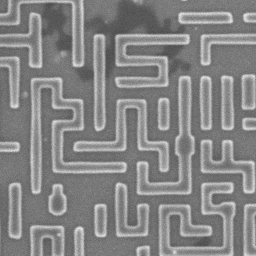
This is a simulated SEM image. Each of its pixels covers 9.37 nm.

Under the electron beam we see wiring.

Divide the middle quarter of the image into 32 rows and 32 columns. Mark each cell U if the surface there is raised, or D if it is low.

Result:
DDDUUDDDUUDDDDDDDDDDDDDUUUDDDDDD
DDDDDDDDUUDDDDDDDDDDDDDDUUDDDDDD
DDDDDDDDUUDDDDDDDDDDDDDDUUDDDDDD
DDDDDDDDUUDDDDDUDDDDDDDUUUDDDUUD
DDDDDDDDUUDDDUUUUUUUUUUUUUDDDUUU
DDDDDDDDUUDDDDUUUUUUUUUUUUDDDUUU
DDDDDDDDUUDDDDDDDDDDDDDDDDDDDUUU
DDDDDDDDUUDDDDDDDDDDDDDDDDDDDUUU
DDDDDDDDUUDDDDDDDDDDDDDDDDDDDUUU
UUUUUDDDUUDDDUUUUUUUDDDDUUDDDUUU
UUUUUDDDUUDDDUUUUUUUDDDDUUDDDUUU
DDUUUDDDUUDDDUUDDDUUDDDDUUDDDUUD
DDDUUDDDUUDDDUUDDDDUDDDDUUDDDUUD
DDUUUDDDUUDDDUUDDDDUDDDDUUDDDUUD
UUUUUDDDUUDDDUUDDDDUDDDDUUDDDUUD
UUUUUDDDUUDDDUUDDDUUDDDDUUDDDUUD
DDDDDDDDUDDDDUUDDDUUDDDDDDDDDUUD
DDDDDDDDDDDDDUUDDDUUDDDDDDDDDUUU
DDDDDDDDDDDDDUUDDDUUUDDDDDDDUUUU
DDDUUUDDDDDDUUUDDDUUUUDDUDDDUUUU
DDDUUUUUUUUUUUUDDDDUUUUUUUDDUUUU
DDDUUUUUUUUUUUUDDDDDDDDUUUDDUUUU
DDDDDDDDDDDDDDDDDDDDDDDDUUDDUUUU
DDDDDDDDDDDDDDDDDDDDDDDDUUDDDUUU
DDDDDDDDDDDDDDDDDDDDDDDDUUDDDUUU
UUUUUUUUUUUUUUUUDDUUUDDDUUDDDUUU
UUUUUUUUUUUUUUUUDDUUUDDDUUDDDUUU
DDDDDDDDDDDDDDDDDDUUUDDDDDDDDUUU
DDDDDDDDDDDDDDDDDDUUUDDDDDDDDUUU
DDDDDDDDDDDDDDDDDDUUUDDDDDDDUUUU
DDDDDDDDDDDDDUUDDDUUUUUUUUUUUUUU
DDDDDDDDDDDDDUUUDDUUUUUUUUUUUUUU